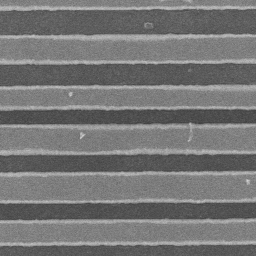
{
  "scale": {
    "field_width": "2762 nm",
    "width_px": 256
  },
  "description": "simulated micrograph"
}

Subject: lines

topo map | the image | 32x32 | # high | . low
################################
................................
................................
................................
################################
################################
################################
################################
................................
................................
................................
################################
################################
################################
................................
.....................#.##...#.##
################################
################################
################################
................................
................................
..................#......#...###
################################
################################
################################
................................
................................
......#...######################
################################
################################
###############################.
................................